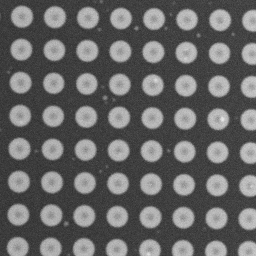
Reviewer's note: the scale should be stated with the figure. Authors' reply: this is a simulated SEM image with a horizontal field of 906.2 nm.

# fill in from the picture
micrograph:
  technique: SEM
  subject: an array of small figures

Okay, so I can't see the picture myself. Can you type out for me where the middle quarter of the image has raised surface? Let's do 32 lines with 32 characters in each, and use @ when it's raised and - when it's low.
--------------------------------
--------------------------------
-----@@-------------------------
----@@@@----@@@@----@@@@-----@@@
---@@@@@---@@@@@----@@@@@---@@@@
---@@@@@---@@@@@@---@@@@@---@@@@
----@@@@----@@@@----@@@@@---@@@@
-----@-------@@------@@@-----@@@
--------------------------------
--------------------------------
--------------------------------
----@@@@----@@@@----@@@@-----@@@
---@@@@@---@@@@@----@@@@@---@@@@
---@@@@@---@@@@@---@@@@@@---@@@@
---@@@@@---@@@@@----@@@@@---@@@@
----@@@-----@@@-----@@@@----@@@@
--------------------------------
--------------------------------
--------------------------------
----@@@-----@@@------@@------@@-
---@@@@@---@@@@@----@@@@----@@@@
---@@@@@---@@@@@---@@@@@@---@@@@
---@@@@@---@@@@@---@@@@@----@@@@
----@@@-----@@@-----@@@@----@@@@
------------------------------@-
--------------------------------
--------------------------------
----@@@-----@@@------@@---------
---@@@@@---@@@@@----@@@@----@@@@
---@@@@@---@@@@@---@@@@@---@@@@@
---@@@@@---@@@@@---@@@@@---@@@@@
---@@@@----@@@@@----@@@@----@@@@